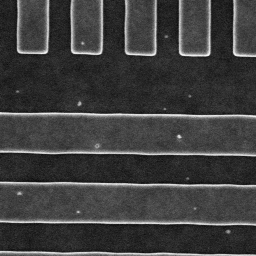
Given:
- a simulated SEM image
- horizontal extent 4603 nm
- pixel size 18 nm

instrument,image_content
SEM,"groups of lines, slits or small figures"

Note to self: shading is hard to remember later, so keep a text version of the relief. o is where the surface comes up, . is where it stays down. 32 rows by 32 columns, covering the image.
..oooo...oooo...ooo...oooo...ooo
..oooo...oooo...ooo...oooo...ooo
..oooo...oooo...ooo...oooo...ooo
..oooo...oooo...ooo...oooo...ooo
..oooo...oooo...ooo...oooo...ooo
..oooo...oooo...ooo...oooo...ooo
...ooo...ooo....ooo....ooo...ooo
................................
................................
................................
................................
................................
................................
................................
oooooooooooooooooooooooo....ooo.
oooooooooooooooooooooooooooooooo
oooooooooooooooooooooooooooooooo
oooooooooooooooooooooooooooooooo
oooooooooooooooooooooooooooooooo
................................
................................
................................
................................
oooooooooooooooooooooooooooooooo
oooooooooooooooooooooooooooooooo
oooooooooooooooooooooooooooooooo
oooooooooooooooooooooooooooooooo
oooooooooooooooooooooooooooooooo
................................
................................
................................
ooo.............................